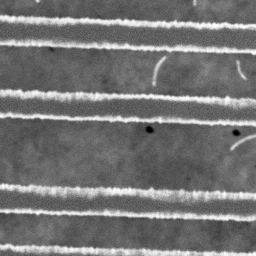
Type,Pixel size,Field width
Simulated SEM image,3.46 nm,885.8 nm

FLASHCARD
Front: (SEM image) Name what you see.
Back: lines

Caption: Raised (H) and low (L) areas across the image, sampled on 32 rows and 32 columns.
LLLLLLLLLLLLLLLLLLLLLLLLLLLLLLLL
LLLLLLLLLLLLLLLLLLLLLLLLLLLLLLLL
HHHHHHLHHLHLLLLLLLLLLLLLLLLLLLLL
HHHHHHHHHHHHHHHHHHHHHHHHHHHHHHHH
HHHHHHHHHHHHHHHHHHHHHHHHHHHHHHHH
LHHHHHHHHHHHHHHHHHHHHHHHHHHHHHHH
LLLLLLLLLLLLLLLLLLLLLLLLLLLLLHHH
LLLLLLLLLLLLLLLLLLLLLLLLLLLLLLLL
LLLLLLLLLLLLLLLLLLLLLLLLLLLLLLLL
LLLLLLLLLLLLLLLLLLLLLLLLLLLLLLLL
LLLLLLLLLLLLLLLLLLLLLLLLLLLLLLLL
HHLLLLLLLLLLLLLLLLLLLLLLLLLLLLLL
HHHHHHHHHHHHHHHHHHHHHHHHHHHLLLLL
HHHHHHHHHHHHHHHHHHHHHHHHHHHHHHHH
HHHHHHHHHHHHHHHHHHHHHHHHHHHHHHHH
LLLLLLLLLLLLLLLLLLLLLLLLLLLLLLHH
LLLLLLLLLLLLLLLLLLLLLLLLLLLLLLLL
LLLLLLLLLLLLLLLLLLLLLLLLLLLLLLLL
LLLLLLLLLLLLLLLLLLLLLLLLLLLLLLLL
LLLLLLLLLLLLLLLLLLLLLLLLLLLLLLLL
LLLLLLLLLLLLLLLLLLLLLLLLLLLLLLLL
LLLLLLLLLLLLLLLLLLLLLLLLLLLLLLLL
LLLLLLLLLLLLLLLLLLLLLLLLLLLLLLLL
HHHHLLLLLLLLLLLLLLLLLLLLLLLLLLLL
HHHHHHHHHHHHHHHHHHHHHHHHHHHHHHHH
HHHHHHHHHHHHHHHHHHHHHHHHHHHHHHHH
LLHHHHHHHHHHHHHHHHHHHHHHHHHHHHHH
LLLLLLLLLLLLLLLLLLLLLLLLLLLLLLLL
LLLLLLLLLLLLLLLLLLLLLLLLLLLLLLLL
LLLLLLLLLLLLLLLLLLLLLLLLLLLLLLLL
LLLLLLLLLLLLLLLLLLLLLLLLLLLLLLLL
HHHHHHHHHHHHHHHHHHLLLLLLLLLLLLLL